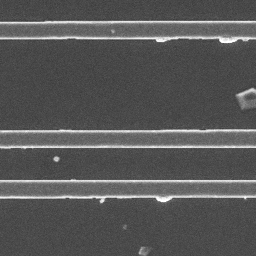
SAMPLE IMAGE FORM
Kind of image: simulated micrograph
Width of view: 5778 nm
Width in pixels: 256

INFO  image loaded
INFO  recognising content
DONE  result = lines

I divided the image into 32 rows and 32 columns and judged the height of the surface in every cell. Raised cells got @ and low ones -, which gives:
--------------------------------
--------------------------------
--------------------------------
@@@@@@@@@@@@@@@@@@@@@@@@@@@@@@@@
@@@@@@@@@@@@@@@@@@@@@@@@@@@@@@@@
--------------------------------
--------------------------------
--------------------------------
--------------------------------
--------------------------------
--------------------------------
-------------------------------@
------------------------------@@
--------------------------------
--------------------------------
--------------------------------
@@@@@@@@@@@@@@@@@@@@@@@@@@@@@@@@
@@@@@@@@@@@@@@@@@@@@@@@@@@@@@@@@
--------------------------------
--------------------------------
--------------------------------
--------------------------------
--------------------------------
@@@@@@@@@@@@@@@@@@@@@@@@@@@@@@@@
@@@@@@@@@@@@@@@@@@@@@@@@@@@@@@@@
--------------------------------
--------------------------------
--------------------------------
--------------------------------
--------------------------------
--------------------------------
--------------------------------